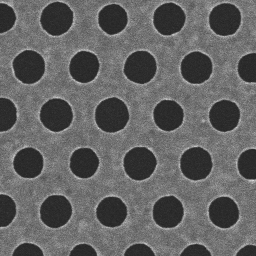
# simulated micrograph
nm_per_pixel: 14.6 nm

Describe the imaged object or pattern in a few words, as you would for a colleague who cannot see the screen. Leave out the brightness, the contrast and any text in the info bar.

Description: a regular array of holes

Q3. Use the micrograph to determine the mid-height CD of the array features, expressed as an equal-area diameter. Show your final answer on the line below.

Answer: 32.5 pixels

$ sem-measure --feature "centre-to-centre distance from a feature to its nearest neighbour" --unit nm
812